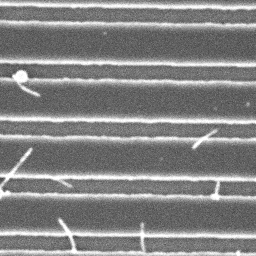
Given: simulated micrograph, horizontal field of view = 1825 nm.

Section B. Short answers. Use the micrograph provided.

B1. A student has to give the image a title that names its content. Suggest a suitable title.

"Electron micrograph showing lines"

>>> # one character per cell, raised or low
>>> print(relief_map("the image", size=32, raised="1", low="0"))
11111111111111111111111111111111
00000000000000000000000000000000
00000000000000000000000000000000
11111111111111111111111111111111
11111111111111111111111111111111
11111111111111111111111111111111
11111111111111111111111111111111
11111111111111111111111111111111
00000000000000000000000000000000
00100000000000000000000000000000
11111111111111111111111111111111
11111111111111111111111111111111
11111111111111111111111111111111
11111111111111111111111111111111
11111111111111111111111111111111
00000000000000000000000000000000
00000000000000000000000000000000
11111111111111111111111111111111
11111111111111111111111111111111
11111111111111111111111111111111
11111111111111111111111111111111
11111111111111111111111111111111
00000000000000000000000000000011
00000000000000000000000000000000
11111111111111111111111101110000
11111111111111111111111111111111
11111111111111111111111111111111
11111111111111111111111111111111
11111111111111111111111111111111
00000000100000000111111111111111
00000000000000000000000000000000
11111111111110111100000000000000